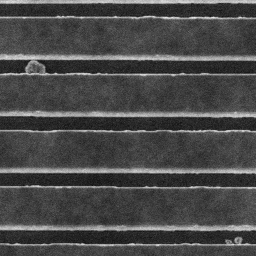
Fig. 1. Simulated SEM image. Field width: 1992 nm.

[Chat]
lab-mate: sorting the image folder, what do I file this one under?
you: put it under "lines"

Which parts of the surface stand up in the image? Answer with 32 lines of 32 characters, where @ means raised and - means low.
--------------------------------
--------------------------------
@@@@@@@@@@@@@@@@@@@@@@@@@@@@@@@@
@@@@@@@@@@@@@@@@@@@@@@@@@@@@@@@@
@@@@@@@@@@@@@@@@@@@@@@@@@@@@@@@@
@@@@@@@@@@@@@@@@@@@@@@@@@@@@@@@@
@@@@@@@@@@@@@@@@@@@@@@@@@@@@@@@@
--------------------------------
--------------------------------
@@@@@@@@@@@@@@@@@@@@@@@@@@@@@@@@
@@@@@@@@@@@@@@@@@@@@@@@@@@@@@@@@
@@@@@@@@@@@@@@@@@@@@@@@@@@@@@@@@
@@@@@@@@@@@@@@@@@@@@@@@@@@@@@@@@
@@@@@@@@@@@@@@@@@@@@@@@@@@@@@@@@
--------------------------------
--------------------------------
@@@@@@@@@@@@@@@@@@@@@@@@@@@@@@@@
@@@@@@@@@@@@@@@@@@@@@@@@@@@@@@@@
@@@@@@@@@@@@@@@@@@@@@@@@@@@@@@@@
@@@@@@@@@@@@@@@@@@@@@@@@@@@@@@@@
@@@@@@@@@@@@@@@@@@@@@@@@@@@@@@@@
--------------------------------
--------------------------------
@@@@@@@@@@@@@@@@@@@@@@@@@@@@@@@@
@@@@@@@@@@@@@@@@@@@@@@@@@@@@@@@@
@@@@@@@@@@@@@@@@@@@@@@@@@@@@@@@@
@@@@@@@@@@@@@@@@@@@@@@@@@@@@@@@@
@@@@@@@@@@@@@@@@@@@@@@@@@@@@@@@@
---@@@@@@@@@@@@@@@@@@@@@@@@@@@@@
--------------------------------
--------------------------------
@@@@@@@@@@@@@@@@@@@@@@@@@@@@@@@@